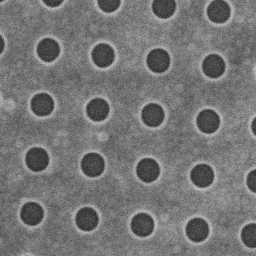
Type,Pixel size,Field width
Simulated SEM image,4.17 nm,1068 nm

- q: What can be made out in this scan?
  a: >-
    a regular array of holes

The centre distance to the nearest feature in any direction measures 228 nanometres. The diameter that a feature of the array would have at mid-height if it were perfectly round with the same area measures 0.104 um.